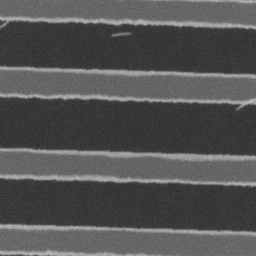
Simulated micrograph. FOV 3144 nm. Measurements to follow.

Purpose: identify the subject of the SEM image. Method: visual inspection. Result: lines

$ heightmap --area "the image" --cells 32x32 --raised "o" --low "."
oooooooooooooooooooooooooooooooo
oooooooooooooooooooooooooooooooo
oo.ooooooooooooooooooooooooooooo
................................
................................
................................
................................
................................
oooo............................
oooooooooooooooooooooooooooooooo
oooooooooooooooooooooooooooooooo
oooooooooooooooooooooooooooooooo
.................ooooooooooooooo
................................
................................
................................
................................
................................
................................
ooooooooooooooooooooooo.........
oooooooooooooooooooooooooooooooo
oooooooooooooooooooooooooooooooo
..............oooooooooooooooooo
................................
................................
................................
................................
................................
ooooooooooooo...................
oooooooooooooooooooooooooooooooo
oooooooooooooooooooooooooooooooo
oooooooooooooooooooooooooooooooo